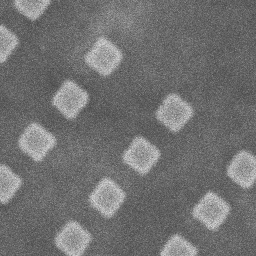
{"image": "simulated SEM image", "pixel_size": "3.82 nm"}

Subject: raised bodies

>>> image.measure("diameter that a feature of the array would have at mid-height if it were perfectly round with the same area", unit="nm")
120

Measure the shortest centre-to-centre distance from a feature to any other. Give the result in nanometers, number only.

207